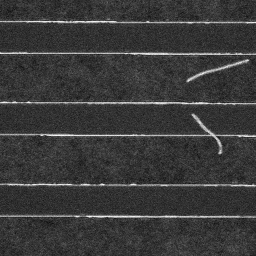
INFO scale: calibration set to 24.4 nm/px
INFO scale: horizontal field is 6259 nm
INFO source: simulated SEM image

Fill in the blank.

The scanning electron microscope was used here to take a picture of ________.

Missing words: lines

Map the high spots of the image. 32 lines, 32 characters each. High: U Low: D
DDDDDDDDDDDDDDDDDDDDDDDDDDDDDDDD
DDDDDDDDDDDDDDDDDDDDDDDDDDDDDDDD
DDDDDDDDDDDDDDDDDDDDDDDDDDDDDDDD
UUUUUUUUUUUUUUUUUUUUUUUUUUUUUUUU
UUUUUUUUUUUUUUUUUUUUUUUUUUUUUUUU
UUUUUUUUUUUUUUUUUUUUUUUUUUUUUUUU
UUUUUUUUUUUUUUUUUUUUUUUUUUUUUUUU
DDDDDDDDDDDDDDDDDDDDDDDDDDDDDDDD
DDDDDDDDDDDDDDDDDDDDDDDDDDDDDDDD
DDDDDDDDDDDDDDDDDDDDDDDDDDDDDDDD
DDDDDDDDDDDDDDDDDDDDDDDDDDDDDDDD
DDDDDDDDDDDDDDDDDDDDDDDDDDDDDDDD
DDDDDDDDDDDDDDDDDDDDDDDDDDDDDDDD
UUUUUUUUUUUUUUUUUUUUUUUUUUUUUUUU
UUUUUUUUUUUUUUUUUUUUUUUUUUUUUUUU
UUUUUUUUUUUUUUUUUUUUUUUUUUUUUUUU
UUUUUUUUUUUUUUUUUUUUUUUUUUUUUUUU
DDDDDDDDDDDDDDDDDDDDDDDDDDDDDDDD
DDDDDDDDDDDDDDDDDDDDDDDDDDDDDDDD
DDDDDDDDDDDDDDDDDDDDDDDDDDDDDDDD
DDDDDDDDDDDDDDDDDDDDDDDDDDDDDDDD
DDDDDDDDDDDDDDDDDDDDDDDDDDDDDDDD
DDDDDDDDDDDDDDDDDDDDDDDDDDDDDDDD
UUUUUUUUUUUUUUUUUUUUUUUUUUUUUUUU
UUUUUUUUUUUUUUUUUUUUUUUUUUUUUUUU
UUUUUUUUUUUUUUUUUUUUUUUUUUUUUUUU
UUUUUUUUUUUUUUUUUUUUUUUUUUUUUUUU
DDDDDDDDDDDDDDDDDDDDDDDDDDDDDDDD
DDDDDDDDDDDDDDDDDDDDDDDDDDDDDDDD
DDDDDDDDDDDDDDDDDDDDDDDDDDDDDDDD
DDDDDDDDDDDDDDDDDDDDDDDDDDDDDDDD
DDDDDDDDDDDDDDDDDDDDDDDDDDDDDDDD